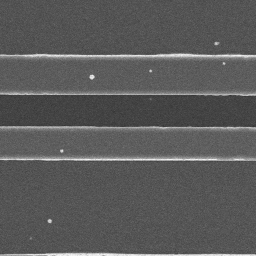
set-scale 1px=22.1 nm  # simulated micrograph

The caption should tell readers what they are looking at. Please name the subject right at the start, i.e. lines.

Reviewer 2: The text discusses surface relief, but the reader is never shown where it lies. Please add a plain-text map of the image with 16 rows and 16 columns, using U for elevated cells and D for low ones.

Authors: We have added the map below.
DDDDDDDDDDDDDDDD
DDDDDDDDDDDDDDDD
DDDDDDDDDDDDDDDD
UUUUUDDDDDDDDDDD
UUUUUUUUUUUUUUUU
UUUUUUUUUUUUUUUU
DDDDDDDDDDDDDDDD
DDDDDDDDDDDDDDDD
UUUUUUUUUUUUUUUU
UUUUUUUUUUUUUUUU
DDDDDDDDDDDDDDDD
DDDDDDDDDDDDDDDD
DDDDDDDDDDDDDDDD
DDDDDDDDDDDDDDDD
DDDDDDDDDDDDDDDD
DDDDDDDDDDDDDDDD